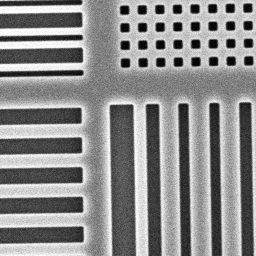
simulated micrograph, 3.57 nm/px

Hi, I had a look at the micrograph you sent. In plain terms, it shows groups of lines, slits or small figures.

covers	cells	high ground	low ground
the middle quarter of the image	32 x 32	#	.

##############...##..##..###..##
....############################
.....###########################
################################
################################
################################
################################
################################
################################
################################
###########......###....####...#
.....######.......##....####...#
.....######.......##....####...#
.....######.......##....####...#
.....######.......##....####...#
###########.......##....####...#
###########.......##....####...#
###########.......##....#####..#
....#######.......##....#####..#
.....######.......##....#####..#
.....######.......##....#####..#
.....######.......##....#####..#
....#######.......##....#####..#
###########.......##....#####..#
###########.......##....#####..#
############......###...#####..#
.....#######......###...#####..#
.....#######......###...#####...
.....#######......###...#####...
.....#######......###...#####...
############......###...#####...
############......###...#####...